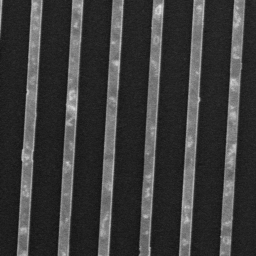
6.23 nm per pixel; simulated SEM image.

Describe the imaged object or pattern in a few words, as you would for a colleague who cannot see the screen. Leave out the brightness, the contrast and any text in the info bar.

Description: parallel lines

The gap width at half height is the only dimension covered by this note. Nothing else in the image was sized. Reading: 190 nm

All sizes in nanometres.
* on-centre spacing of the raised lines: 252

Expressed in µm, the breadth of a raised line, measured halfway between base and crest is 0.0638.